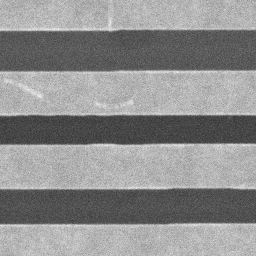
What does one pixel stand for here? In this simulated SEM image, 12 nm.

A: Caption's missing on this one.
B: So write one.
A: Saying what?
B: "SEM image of lines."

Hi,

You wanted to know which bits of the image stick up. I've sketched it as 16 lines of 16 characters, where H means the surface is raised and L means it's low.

HHHHHHHHHHHHHHHH
HHHHHHHHHHHHHHHH
LLLLLLLLLLLLLLLL
LLLLLLLLLLLLLLLL
LLLLLLLHHHHHHHHH
HHHHHHHHHHHHHHHH
HHHHHHHHHHHHHHHH
LLLLLLLLLLLLLLLL
LLLLLLLLLLLLLLLL
HHHHHHHHHHHHHHHH
HHHHHHHHHHHHHHHH
HHHHHHHHHHHHHHHH
LLLLLLLLLLLLLLLL
LLLLLLLLLLLLLLLL
HHHHHHHHHHHHHHHH
HHHHHHHHHHHHHHHH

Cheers